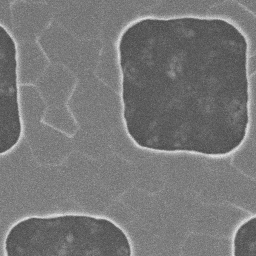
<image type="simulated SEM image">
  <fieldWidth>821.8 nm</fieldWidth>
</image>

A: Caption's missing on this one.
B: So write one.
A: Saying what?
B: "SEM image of holes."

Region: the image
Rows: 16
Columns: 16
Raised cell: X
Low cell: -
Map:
XXXXXXXXXXXXXXXX
XXXXXXXX------XX
-XXXXXXX-------X
-XXXXXX--------X
-XXXXXXX-------X
-XXXXXXX-------X
-XXXXXXX-------X
-XXXXXXX-------X
-XXXXXXX-------X
XXXXXXXXXXXX--XX
XXXXXXXXXXXXXXXX
XXXXXXXXXXXXXXXX
XXXXXXXXXXXXXXXX
XXXX-XXXXXXXXXXX
X-------XXXXXXX-
--------XXXXXXX-